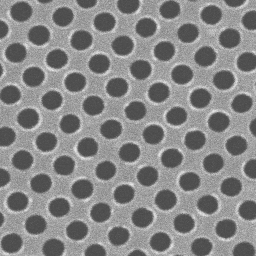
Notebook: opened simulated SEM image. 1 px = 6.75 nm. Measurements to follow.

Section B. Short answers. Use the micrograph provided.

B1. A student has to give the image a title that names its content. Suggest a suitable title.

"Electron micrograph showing a regular array of holes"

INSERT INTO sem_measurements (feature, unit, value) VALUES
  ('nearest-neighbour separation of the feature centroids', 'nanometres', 199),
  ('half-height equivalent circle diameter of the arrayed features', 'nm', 144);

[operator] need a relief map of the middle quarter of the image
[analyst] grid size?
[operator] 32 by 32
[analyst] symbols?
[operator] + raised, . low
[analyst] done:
++++++......++++......++++++...+
+++++++....+++++......+++++.....
+....+++.++++++++.....+++++.....
.....+++++++...+++...++++++.....
......+++++.....+++++++.+++....+
.....+++++......++++++....++++++
+....++++++.....+++++.....++++++
+++++++++++....++++++.....++++++
++++++...++++++++++++.....+++++.
+++++.....+++++++...++...++++++.
+++++.....++++++....++++++++.+++
+++++.....+++++......+++++....++
+.++++...++++++......+++++.....+
....++++++++++++....+++++......+
....++++++....++++++++++++....++
....+++++......++++++...+++.++++
...++++++......+++++.....+++++++
+.+++++++.....++++++.....++++++.
+++++..+++...+++++++.....+++++..
++++....++++++++++++....++++++..
+++......+++++.....++++++++++++.
+++......+++++.....++++++....+++
++++....++++++.....+++++.....+++
..++++++++++++.....+++++......++
...++++++...+++..+++++++......++
...+++++.....++++++++.+++....+++
...+++++.....++++++....+++++++++
.+++++++.....+++++......++++++..
++++++++....++++++......+++++...
+++....++++++++++++....++++++...
++.....+++++++...++...+++++++...
++.....++++++.....+++++++.++++..